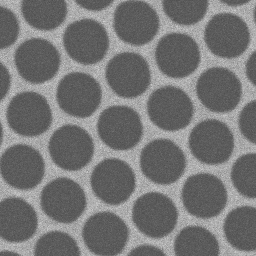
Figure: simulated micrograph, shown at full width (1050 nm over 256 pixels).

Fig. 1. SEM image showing a regular array of holes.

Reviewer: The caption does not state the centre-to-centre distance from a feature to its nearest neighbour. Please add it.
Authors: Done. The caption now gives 217 nanometres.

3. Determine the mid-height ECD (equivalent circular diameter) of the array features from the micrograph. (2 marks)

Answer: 187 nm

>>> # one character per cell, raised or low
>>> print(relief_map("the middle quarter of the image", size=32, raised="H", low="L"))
HHHHHHHHHHHLLLLLLLLLLHHLLLLLLLLL
HHHHHHHHHHLLLLLLLLLLLHHHLLLLLLLL
HLLLLLHHHHLLLLLLLLLLLLHHHLLLLLLL
LLLLLLLHHHLLLLLLLLLLLLHHHHHLLLHH
LLLLLLLLHHHLLLLLLLLLLLHHHHHHHHHH
LLLLLLLLLHHLLLLLLLLLLHHHHHLHHHHH
LLLLLLLLLHHHLLLLLLLLLHHLLLLLLLHH
LLLLLLLLLHHHHLLLLLLHHHLLLLLLLLLH
LLLLLLLLLHHHHHHLLHHHHLLLLLLLLLLH
LLLLLLLLLHHHHHHHHHHHHLLLLLLLLLLL
LLLLLLLLLHHHLLLLHHHHHLLLLLLLLLLL
LLLLLLLLHHLLLLLLLHHHHLLLLLLLLLLL
HLLLLLLHHLLLLLLLLLLHHLLLLLLLLLLL
HHHHHHHHHLLLLLLLLLLHHLLLLLLLLLLL
HHHHHHHHLLLLLLLLLLLHHHLLLLLLLLLL
LLLLHHHHLLLLLLLLLLLLHHHLLLLLLLLH
LLLLLHHHLLLLLLLLLLLLHHHHHLLLLHHH
LLLLLLHHHLLLLLLLLLLLHHHHHHHHHHHL
LLLLLLLHHLLLLLLLLLLHHHHHHHHHHHHL
LLLLLLLHHHLLLLLLLLLHHHLLLLLHHHHL
LLLLLLLLHHHLLLLLLLHHLLLLLLLLHHHL
LLLLLLLLHHHHHLLLHHHLLLLLLLLLLHHH
LLLLLLLHHHHHHHHHHHHLLLLLLLLLLLHH
LLLLLLLHHHHHHHHHHHHLLLLLLLLLLLHH
LLLLLLHHHLLLLLLHHHHLLLLLLLLLLLLH
LLLLLHHHLLLLLLLLHHHLLLLLLLLLLLHH
LLLLHHHLLLLLLLLLLHHLLLLLLLLLLLHH
HHHHHHHLLLLLLLLLLLHHLLLLLLLLLLHH
LHHHHHHLLLLLLLLLLLHHHLLLLLLLLHHL
LLLHHHLLLLLLLLLLLLHHHHLLLLLLHHLL
LLLLHHHLLLLLLLLLLLHHHHHHHHHHHHLL
LLLLLHHLLLLLLLLLLLHHHHHHHHHHHHLL